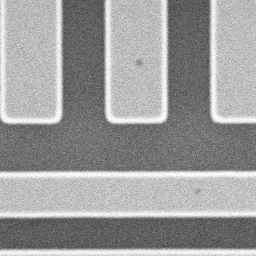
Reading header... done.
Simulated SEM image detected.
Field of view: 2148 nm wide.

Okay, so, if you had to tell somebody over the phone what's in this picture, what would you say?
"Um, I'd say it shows groups of lines, slits or small figures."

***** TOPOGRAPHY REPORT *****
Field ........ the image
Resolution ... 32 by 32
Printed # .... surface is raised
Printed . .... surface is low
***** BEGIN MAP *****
#######......########.....######
########.....########.....######
########.....########.....######
########.....########.....######
#######......########.....######
#######......########.....######
#######......########.....######
########.....########.....######
########.....########.....######
########.....########.....######
########.....########.....######
########.....########.....######
########.....########.....######
########.....########......#####
#######......########......#####
................................
................................
................................
................................
................................
................................
................................
################################
################################
################################
################################
################################
................................
................................
................................
................................
################################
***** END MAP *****